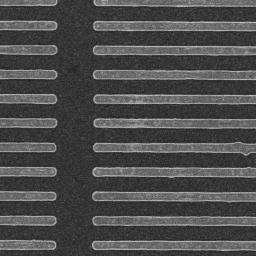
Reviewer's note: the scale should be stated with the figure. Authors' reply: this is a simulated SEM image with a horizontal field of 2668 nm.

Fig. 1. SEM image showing parallel lines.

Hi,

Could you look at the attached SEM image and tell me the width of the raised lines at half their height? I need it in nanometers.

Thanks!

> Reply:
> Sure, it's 92.5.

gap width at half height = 0.162 µm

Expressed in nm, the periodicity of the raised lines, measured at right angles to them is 254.